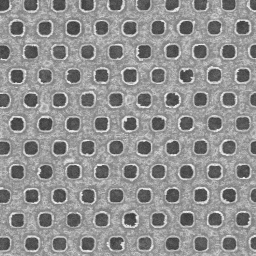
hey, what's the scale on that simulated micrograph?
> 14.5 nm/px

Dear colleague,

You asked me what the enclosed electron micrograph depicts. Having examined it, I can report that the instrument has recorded a regular array of holes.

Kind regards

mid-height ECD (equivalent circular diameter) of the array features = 208 nanometres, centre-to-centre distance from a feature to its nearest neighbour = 0.398 um